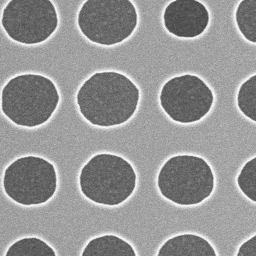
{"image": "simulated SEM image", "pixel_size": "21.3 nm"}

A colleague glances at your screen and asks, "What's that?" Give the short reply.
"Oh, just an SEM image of holes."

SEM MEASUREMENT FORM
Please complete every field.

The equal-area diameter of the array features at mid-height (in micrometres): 1.15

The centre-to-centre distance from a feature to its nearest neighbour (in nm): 1670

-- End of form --